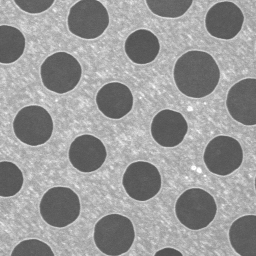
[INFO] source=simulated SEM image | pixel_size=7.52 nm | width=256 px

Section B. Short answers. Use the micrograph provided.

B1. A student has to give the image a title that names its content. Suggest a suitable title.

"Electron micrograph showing a regular array of holes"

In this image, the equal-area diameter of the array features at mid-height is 297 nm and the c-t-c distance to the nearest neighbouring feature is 451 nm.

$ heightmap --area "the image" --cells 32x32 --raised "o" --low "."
oo.....oo....ooooo......ooo..ooo
ooo..oooo....oooooo....ooo....oo
oooooooo......oooooooooooo....oo
..ooooooo....ooooooooooooo....oo
...ooooooo..oooo...oooooooo..ooo
...ooooooooooooo....oooooooooooo
...oooo.oooooooo....ooo...oooooo
..oooo....oooooo...ooo.....ooooo
ooooo.....oooooooooooo.....ooooo
ooooo.....oooooooooooo.....ooooo
ooooo.....ooo..ooooooo.....oo...
ooooooo.oooo....ooooooo...ooo...
oooooooooooo.....ooooooooooo....
ooo..ooooooo....oooooooooooo....
oo....ooooooo...ooo....oooooo...
oo.....oooooooooooo....ooooooo..
oo.....oooooooooooo....ooooooooo
oo....ooo...ooooooo....ooo....oo
ooooooooo....ooooooooooooo....oo
ooooooooo....oooooooooooo.....oo
..ooooooo....ooo...ooooooo....oo
...ooooooo.ooooo....oooooo...ooo
...oooooooooooo.....oooooooooooo
...ooo...ooooooo....oooo.ooooooo
.oooo.....oooooo...oooo...oooooo
ooooo.....oooooooooooo.....ooooo
ooooo.....oooooooooooo.....ooooo
ooooo....ooo....oooooo.....oo...
oooooooooooo.....oooooo..oooo...
oooooooooooo.....oooooooooooo...
oo....oooooo.....oooooooooooo...
o......oooooo...oooo..oooooooo..